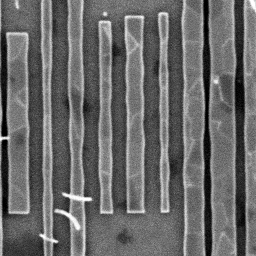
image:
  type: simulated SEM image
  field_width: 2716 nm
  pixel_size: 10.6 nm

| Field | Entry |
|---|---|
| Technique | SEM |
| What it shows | groups of lines, slits or small figures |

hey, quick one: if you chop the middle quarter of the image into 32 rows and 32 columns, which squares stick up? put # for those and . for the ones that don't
.####....###....####....##....##
.####....###....####....##....##
.####....###....####....##....##
.####....###....####....##....##
.####....###....####....##....##
.####....###....####....##....##
.####....###....####....##....##
.####....###....####....##....##
.####....###....####....##....##
.####....##.....####....##....##
.####....##.....####....##....##
..##.....##.....####....##....##
..###....##.....####....##....##
.####....###....####....##....##
.####....###....####....##....##
.####....###....####....##....##
.####....###....####....##....##
.####....###....####....##....##
.####....###....####....##....##
.####....###....####....##....##
..##.....###....####....##....##
..##.....###....####....##....##
..##.....###....####....##....##
..##.....###....####....##....##
..##.....###....####....##....##
..##.....###....####....##....##
..###....###....####....##....##
..###....###....####....##....##
..###....###....####....##....##
..###....###....####....##....##
..###....###....####....##....##
..###....###....####....##....##